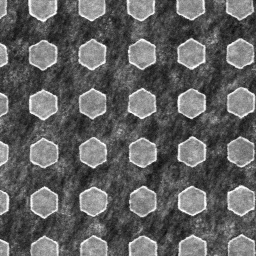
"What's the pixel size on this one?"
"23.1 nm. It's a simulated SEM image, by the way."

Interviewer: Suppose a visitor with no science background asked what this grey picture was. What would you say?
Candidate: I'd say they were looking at a regular array of raised bodies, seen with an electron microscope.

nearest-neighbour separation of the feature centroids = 1130 nm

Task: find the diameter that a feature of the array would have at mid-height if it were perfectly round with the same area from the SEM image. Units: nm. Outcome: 638